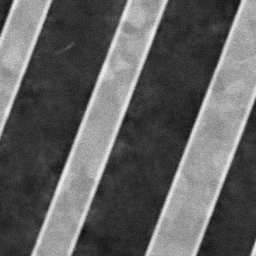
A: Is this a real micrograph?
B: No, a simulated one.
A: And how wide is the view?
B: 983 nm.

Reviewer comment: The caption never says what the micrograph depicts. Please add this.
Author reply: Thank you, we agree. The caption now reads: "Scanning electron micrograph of one or a few lines or trenches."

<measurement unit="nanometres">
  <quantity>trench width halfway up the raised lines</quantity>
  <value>278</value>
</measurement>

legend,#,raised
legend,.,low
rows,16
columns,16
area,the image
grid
.##.....##.....#
###.....##.....#
##.....##.....##
##.....##.....##
#.....###.....##
#.....##.....###
#.....##.....###
.....###....###.
.....##.....###.
.....##.....###.
....##.....###..
....##.....###..
...###....###...
...##.....###...
...##.....###...
..##.....###....